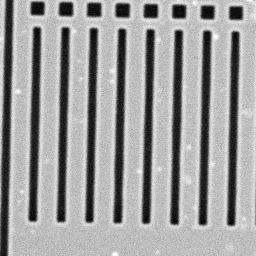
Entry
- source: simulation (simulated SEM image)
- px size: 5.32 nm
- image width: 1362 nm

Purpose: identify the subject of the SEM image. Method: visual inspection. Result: groups of lines, slits or small figures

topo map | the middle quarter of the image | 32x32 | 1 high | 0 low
00111100011110001111000111100011
00111100111110011111000111100011
00111100111110011111000111100011
01111100111110011111000111100011
01111100111110011111000111100011
01111100111110011111000111100011
01111100111110011111000111100011
01111100111110011111000111100011
01111100111110011111000111100011
01111100111110011111001111100011
01111100111110011111001111100011
01111100111110011111001111100011
01111100111110011111001111100011
01111100111110011111001111100011
01111100111110011111001111100011
01111100111110011111001111100111
01111100111110011111001111100111
01111100111110011111001111100111
01111100111110011111001111100111
01111100111110011111001111100111
01111100111110011111001111100111
01111100111110011111001111100111
01111100111110011111001111100111
01111100111110011111001111100111
01111100111100011111001111100111
01111100111100011111001111100111
01111100111100011111001111100111
01111100111100011111001111100111
01111100111100011110001111100111
01111100111100011110001111100111
01111000111100011110001111100111
01111000111100011110001111100111